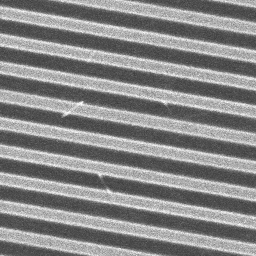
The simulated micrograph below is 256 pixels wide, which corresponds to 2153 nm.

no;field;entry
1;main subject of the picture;parallel lines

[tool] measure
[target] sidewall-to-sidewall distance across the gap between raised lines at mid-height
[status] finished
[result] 13.9 px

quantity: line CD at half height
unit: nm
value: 118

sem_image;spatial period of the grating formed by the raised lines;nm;229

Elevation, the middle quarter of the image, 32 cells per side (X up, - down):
------------XXXXXXXXXXXXXXXXXXXX
------------------XXXXXXXXXXXXXX
XXX---------------------XXXXXXXX
XXXXXXXX----------------------XX
XXXXXXXXXXXXXX------------------
-XXXXXXXXXXXXXXXXXXX------------
-------XXXXXXXXXXXXXXXXXXXX-----
-------------XXXXXXXXXXXXXXXXXX-
-------------------XXXXXXXXXXXXX
XXX----------------------XXXXXXX
XXXXXXXXX---------------------XX
XXXXXXXXXXXXXXX-----------------
XXXXXXXXXXXXXXXXXXXXX-----------
-------XXXXXXXXXXXXXXXXXXX------
------------XXXXXXXXXXXXXXXXXXXX
------------------XXXXXXXXXXXXXX
XXXX--------------------XXXXXXXX
XXXXXXXXXX--------------------XX
XXXXXXXXXXXXXXXX----------------
--XXXXXXXXXXXXXXXXXXX-----------
-------XXXXXXXXXXXXXXXXXXXX-----
-------------XXXXXXXXXXXXXXXXXXX
-------------------XXXXXXXXXXXXX
XXX----------------------XXXXXXX
XXXXXXXXXX--------------------XX
XXXXXXXXXXXXXXX-----------------
--XXXXXXXXXXXXXXXXXXXX----------
--------XXXXXXXXXXXXXXXXXXXX----
--------------XXXXXXXXXXXXXXXXXX
--------------------XXXXXXXXXXXX
XXXXX--------------------XXXXXXX
XXXXXXXXXXX--------------------X